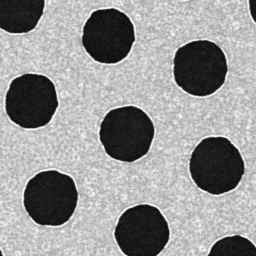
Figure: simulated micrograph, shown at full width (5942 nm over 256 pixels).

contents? holes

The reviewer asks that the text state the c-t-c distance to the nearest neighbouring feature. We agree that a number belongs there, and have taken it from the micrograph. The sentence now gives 2250 nanometres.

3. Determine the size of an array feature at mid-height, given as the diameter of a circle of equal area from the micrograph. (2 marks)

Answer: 1.3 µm